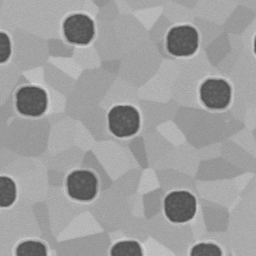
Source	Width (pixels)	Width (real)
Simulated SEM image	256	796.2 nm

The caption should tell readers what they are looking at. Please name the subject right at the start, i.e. holes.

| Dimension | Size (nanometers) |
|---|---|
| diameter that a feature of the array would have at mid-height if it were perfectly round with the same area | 106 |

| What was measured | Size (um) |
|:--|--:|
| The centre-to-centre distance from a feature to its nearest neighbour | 0.239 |